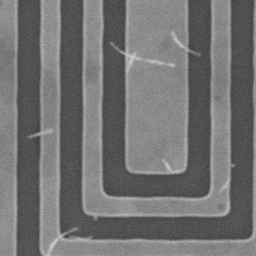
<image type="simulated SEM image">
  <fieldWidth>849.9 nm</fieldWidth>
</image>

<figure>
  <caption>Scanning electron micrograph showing groups of lines, slits or small figures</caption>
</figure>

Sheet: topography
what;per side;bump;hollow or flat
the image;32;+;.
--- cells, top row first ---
++...++....++...+++++++....++...
++...++....++...+++++++....++...
++...++....++...+++++++....++...
++...++...+++...+++++++....++...
++...++...+++...+++++++....++...
++...++....++...+++++++....++...
++...++...+++...++++++++..+++...
++...++...+++...+++++++....++...
++...++...+++...+++++++....++...
++...++...+++...+++++++....++...
++...++...+++...+++++++...+++...
++...++...+++...+++++++...+++...
++...++...+++...+++++++....++...
++...++...+++...+++++++...+++...
++...++...+++...+++++++...+++...
++...++...+++...+++++++....++...
++...++...+++...+++++++....++...
++...++...+++...+++++++....++...
++...++...+++...+++++++...+++...
++...++...+++...+++++++...+++...
++...++...+++...+++++++...+++...
++...++...+++....+++++....+++...
++...++...+++.............+++...
++...++...+++.............+++...
++...++...+++.............+++...
++...++...+++++++++++++++++++...
++...++....+++++++++++++++++....
++...++.........................
++...++.........................
++...+++........................
++...+++++++++++++++++++++++++++
++...+++++++++++++++++++++++++++